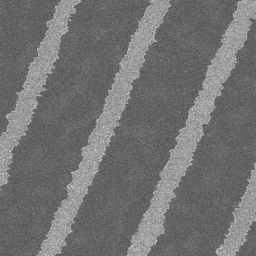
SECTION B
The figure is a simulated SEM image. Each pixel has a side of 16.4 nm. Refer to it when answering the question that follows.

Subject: one or a few lines or trenches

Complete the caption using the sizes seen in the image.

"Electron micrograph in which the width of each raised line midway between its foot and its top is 301 nm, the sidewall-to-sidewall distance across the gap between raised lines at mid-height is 1030 nanometres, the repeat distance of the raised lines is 1330 nm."